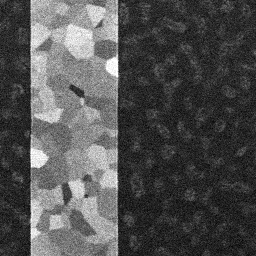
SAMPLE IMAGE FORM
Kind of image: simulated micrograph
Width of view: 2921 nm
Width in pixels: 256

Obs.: one or a few lines or trenches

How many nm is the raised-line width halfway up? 984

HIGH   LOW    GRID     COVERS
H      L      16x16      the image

LLHHHHHLLLLLLLLL
LLHHHHHLLLLLLLLL
LLHHHHHLLLLLLLLL
LLHHHHHLLLLLLLLL
LLHHHHHLLLLLLLLL
LLHHHHHLLLLLLLLL
LLHHHHHLLLLLLLLL
LLHHHHHLLLLLLLLL
LLHHHHHLLLLLLLLL
LLHHHHHLLLLLLLLL
LLHHHHHLLLLLLLLL
LLHHHHHLLLLLLLLL
LLHHHHHLLLLLLLLL
LLHHHHHLLLLLLLLL
LLHHHHHLLLLLLLLL
LLHHHHHLLLLLLLLL